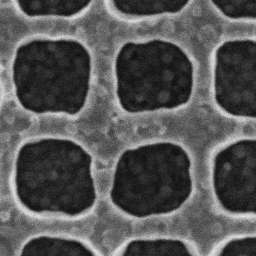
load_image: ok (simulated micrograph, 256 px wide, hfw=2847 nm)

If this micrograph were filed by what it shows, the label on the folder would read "holes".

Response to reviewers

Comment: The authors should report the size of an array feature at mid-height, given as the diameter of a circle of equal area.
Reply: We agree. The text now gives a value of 0.884 micrometres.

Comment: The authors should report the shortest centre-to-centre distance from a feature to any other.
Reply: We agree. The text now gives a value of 1100 nanometres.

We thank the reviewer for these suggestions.